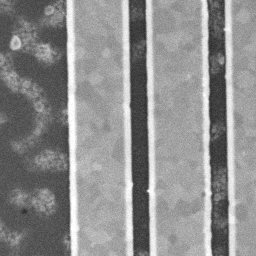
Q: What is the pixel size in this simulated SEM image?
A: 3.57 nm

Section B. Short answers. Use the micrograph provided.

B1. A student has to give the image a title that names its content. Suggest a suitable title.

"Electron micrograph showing one or a few lines or trenches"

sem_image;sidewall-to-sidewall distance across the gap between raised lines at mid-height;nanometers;84.3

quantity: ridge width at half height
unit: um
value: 0.199